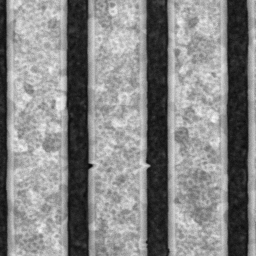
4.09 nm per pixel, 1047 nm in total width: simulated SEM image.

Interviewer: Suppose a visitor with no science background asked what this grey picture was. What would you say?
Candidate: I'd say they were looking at one or a few lines or trenches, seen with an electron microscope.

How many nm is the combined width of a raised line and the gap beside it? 328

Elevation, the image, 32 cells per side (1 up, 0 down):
01111111000111111100011111110001
01111111000111111100011111110001
01111111000111111100011111110001
01111111000111111100011111110001
01111111000111111100011111110001
01111111000111111100011111110001
01111111000111111100011111110001
01111111000111111100011111110001
01111111000111111100011111110001
01111111000111111100011111110001
01111111000111111100011111110001
01111111000111111100011111110001
01111111000111111100011111110001
01111111000111111100011111110001
01111111000111111100011111110001
01111111000111111100011111110001
01111111000111111100011111110001
01111111000111111100011111110001
01111111000111111100011111110001
01111111000111111100011111110001
01111111000011111100011111110001
01111111000111111100011111110001
01111111000111111100011111110001
01111111000111111100011111110001
01111111000111111100011111110001
01111111000111111100011111110001
01111111000111111100011111110001
01111111000111111100011111110001
01111111000111111100011111110001
01111111000111111100011111110001
01111111000111111100011111110001
01111111000111111100001111110001